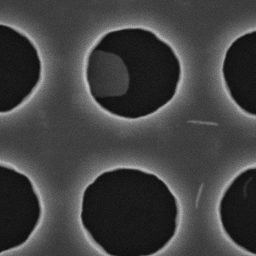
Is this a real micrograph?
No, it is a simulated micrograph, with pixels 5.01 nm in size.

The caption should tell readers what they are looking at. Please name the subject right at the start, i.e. holes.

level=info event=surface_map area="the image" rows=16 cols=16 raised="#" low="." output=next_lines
################
################
..####....#####.
..####.....###..
...##......###..
..####.....###..
.#####....#####.
################
################
################
.###############
..####....####..
..###......###..
...##......###..
..###......###..
.#####....#####.